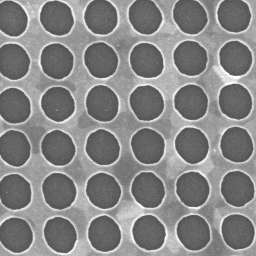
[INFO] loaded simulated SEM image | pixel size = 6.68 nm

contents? a regular array of holes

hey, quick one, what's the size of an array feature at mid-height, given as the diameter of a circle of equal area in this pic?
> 0.238 micrometres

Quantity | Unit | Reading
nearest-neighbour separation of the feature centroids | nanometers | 288